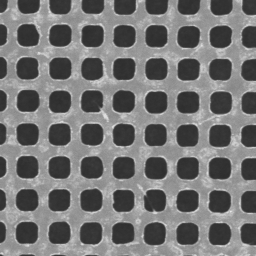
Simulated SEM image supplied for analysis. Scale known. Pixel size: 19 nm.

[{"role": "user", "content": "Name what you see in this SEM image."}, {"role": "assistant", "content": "a regular array of holes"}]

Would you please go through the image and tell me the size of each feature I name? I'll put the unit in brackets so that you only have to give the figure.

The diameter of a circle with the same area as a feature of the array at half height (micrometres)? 0.448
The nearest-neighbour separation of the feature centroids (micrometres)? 0.606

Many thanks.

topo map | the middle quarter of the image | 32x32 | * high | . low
..**......**......**......**....
..**......**......**......**....
..**......**......**......**....
.****....****....****....****...
********************************
********************************
******..******..****************
..***.....***.....***....****...
..**......**......**......**....
..**......**......**......**....
..**......**......**......**....
.****....****....****....***....
********************************
********************************
********************************
.****....****....****....****...
..**......**......**......**....
..**......**......**......**....
..**......**......**......**....
.****....***.....***......**....
*******.*****...******..*****...
********************************
********************************
.****....****....****....****...
..**.....***......**......**....
..**......**......**......**....
..**......**......**......**....
..**......**......**......**....
******...****....****....****...
********************************
********************************
.****....*****..*****...******..